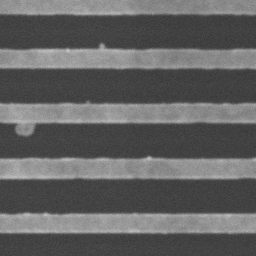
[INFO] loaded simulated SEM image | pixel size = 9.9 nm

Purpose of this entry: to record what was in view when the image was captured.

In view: lines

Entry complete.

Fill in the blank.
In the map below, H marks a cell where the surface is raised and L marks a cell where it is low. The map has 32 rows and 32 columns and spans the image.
HHHHHHHHHHHHHHHHHHHHHHHHHHHHHHHH
HHHHHHHHHHHHHHHHHHHHHHHHHHHHHHHH
LLLLLLLLLLLLLLLLLLLLLLLLLLLLLLLL
LLLLLLLLLLLLLLLLLLLLLLLLLLLLLLLL
LLLLLLLLLLLLLLLLLLLLLLLLLLLLLLLL
LLLLLLLLLLLLLLLLLLLLLLLLLLLLLLLL
HHHHHHHHHHHHHHHHHHHHHHHHHHHHHHHH
HHHHHHHHHHHHHHHHHHHHHHHHHHHHHHHH
LLLLLLLLLLLLLLHHLLHLLHHLLHHLHHLH
LLLLLLLLLLLLLLLLLLLLLLLLLLLLLLLL
LLLLLLLLLLLLLLLLLLLLLLLLLLLLLLLL
LLLLLLLLLLLLLLLLLLLLLLLLLLLLLLLL
LLLLLLLLLLLLLLLLLLLLLLLLLLLLLLLL
HHHHHHHHHHHHHHHHHHHHHHHHHHHHHHHH
HHHHHHHHHHHHHHHHHHHHHHHHHHHHHHHH
LLLLLLLLLLLLLLLLLLLLLLLLLLLLLLLL
LLLLLLLLLLLLLLLLLLLLLLLLLLLLLLLL
LLLLLLLLLLLLLLLLLLLLLLLLLLLLLLLL
LLLLLLLLLLLLLLLLLLLLLLLLLLLLLLLL
LLLLLLLLLLLLLLLLLLLLLLLLLLLLLLLL
HHHHHHHHHHHHHHHHHHHHHHHHHHHHHHHH
HHHHHHHHHHHHHHHHHHHHHHHHHHHHHHHH
LLLLLLLLLLLLLLLLLLLLLLLLLLLLLLLL
LLLLLLLLLLLLLLLLLLLLLLLLLLLLLLLL
LLLLLLLLLLLLLLLLLLLLLLLLLLLLLLLL
LLLLLLLLLLLLLLLLLLLLLLLLLLLLLLLL
LLLLLLLLLLLLLLLLLLLLLLLLLLLLLLLL
HHHHHHHHHHHHHHHHHHHHHHHHHHHHHHHH
HHHHHHHHHHHHHHHHHHHHHHHHHHHHHHHH
LLLLLLLLLLLLLLLLLLLLLLLLLLLLLLLL
LLLLLLLLLLLLLLLLLLLLLLLLLLLLLLLL
LLLLLLLLLLLLLLLLLLLLLLLLLLLLLLLL